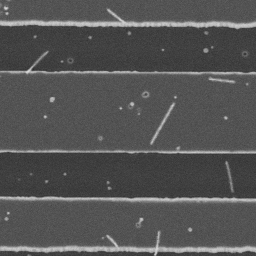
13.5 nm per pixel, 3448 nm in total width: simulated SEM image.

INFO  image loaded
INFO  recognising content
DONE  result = lines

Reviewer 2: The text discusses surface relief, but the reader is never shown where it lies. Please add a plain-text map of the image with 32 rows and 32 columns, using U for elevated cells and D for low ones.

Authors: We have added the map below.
UUUUUUUUUUUUUUUUUUUUUUUUUUUUUUUU
UUUUUUUUUUUUUUUUUUUUUUUUUUUUUUUU
UUUUUUUUUUUUUUUUUUUUUUUUUUUUUUUU
DDDDDDDDDDDDDDDDDDDDDDDDDDDDDDDD
DDDDDDDDDDDDDDDDDDDDDDDDDDDDDDDD
DDDDDDDDDDDDDDDDDDDDDDDDDDDDDDDD
DDDDDDDDDDDDDDDDDDDDDDDDDDDDDDDD
DDDDDDDDDDDDDDDDDDDDDDDDDDDDDDDD
DDDDDDDDDDDDDDDDDDDDDDDDDDDDDDDD
UUUUUUUUUUUUUUUUUUUUUUUUUUUUUUUU
UUUUUUUUUUUUUUUUUUUUUUUUUUUUUUUU
UUUUUUUUUUUUUUUUUUUUUUUUUUUUUUUU
UUUUUUUUUUUUUUUUUUUUUUUUUUUUUUUU
UUUUUUUUUUUUUUUUUUUUUUUUUUUUUUUU
UUUUUUUUUUUUUUUUUUUUUUUUUUUUUUUU
UUUUUUUUUUUUUUUUUUUUUUUUUUUUUUUU
UUUUUUUUUUUUUUUUUUUUUUUUUUUUUUUU
UUUUUUUUUUUUUUUUUUUUUUUUUUUUUUUU
UUUUUUUUUUUUUUUUUUUUUUUUUUUUUUUU
DDDDDDDDDDDDDDDDDDDDDDDDDDDDDDDD
DDDDDDDDDDDDDDDDDDDDDDDDDDDDDDDD
DDDDDDDDDDDDDDDDDDDDDDDDDDDDDDDD
DDDDDDDDDDDDDDDDDDDDDDDDDDDDDDDD
DDDDDDDDDDDDDDDDDDDDDDDDDDDDDDDD
DDDDDDDDDDDDDDDDDDDDDDDDDDDDDDDD
UUUUUUUUUUUUUUUUUUUUUUUUUUUUUUUU
UUUUUUUUUUUUUUUUUUUUUUUUUUUUUUUU
UUUUUUUUUUUUUUUUUUUUUUUUUUUUUUUU
UUUUUUUUUUUUUUUUUUUUUUUUUUUUUUUU
UUUUUUUUUUUUUUUUUUUUUUUUUUUUUUUU
UUUUUUUUUUUUUUUUUUUUUUUUUUUUUUUU
DDDDDDDDDDDDDDDDDDDDDDDDDDDDDDDD